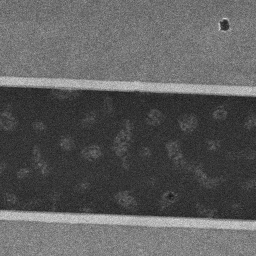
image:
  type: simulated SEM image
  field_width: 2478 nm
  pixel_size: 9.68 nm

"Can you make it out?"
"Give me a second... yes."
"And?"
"one or a few lines or trenches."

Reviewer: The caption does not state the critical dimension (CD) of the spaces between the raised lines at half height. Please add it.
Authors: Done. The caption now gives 1300 nm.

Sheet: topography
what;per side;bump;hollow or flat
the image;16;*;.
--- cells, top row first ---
****************
****************
****************
****************
****************
..........******
................
................
................
................
................
................
................
**..............
****************
****************